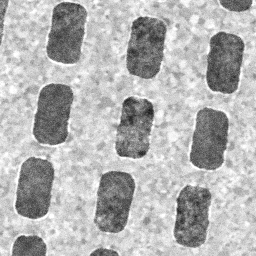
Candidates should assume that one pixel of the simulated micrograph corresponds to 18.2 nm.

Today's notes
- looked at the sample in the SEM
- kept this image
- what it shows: a regular array of holes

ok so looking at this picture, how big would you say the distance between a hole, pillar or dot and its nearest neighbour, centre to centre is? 1390 nm